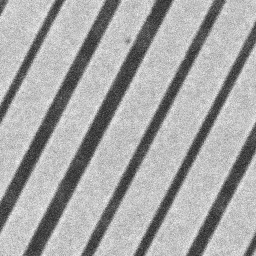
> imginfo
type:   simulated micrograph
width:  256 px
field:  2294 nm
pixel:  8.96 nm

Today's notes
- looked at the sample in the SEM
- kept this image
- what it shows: parallel lines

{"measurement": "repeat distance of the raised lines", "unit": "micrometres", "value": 0.426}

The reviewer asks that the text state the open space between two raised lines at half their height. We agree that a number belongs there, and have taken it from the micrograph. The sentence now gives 0.108 microns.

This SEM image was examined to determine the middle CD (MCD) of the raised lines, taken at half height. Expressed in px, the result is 34.4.